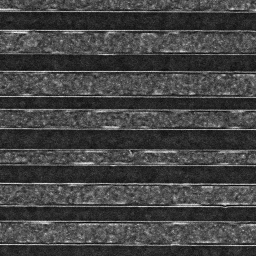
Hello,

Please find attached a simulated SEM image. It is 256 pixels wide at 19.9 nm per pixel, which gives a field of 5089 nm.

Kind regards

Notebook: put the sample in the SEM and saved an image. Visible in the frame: parallel lines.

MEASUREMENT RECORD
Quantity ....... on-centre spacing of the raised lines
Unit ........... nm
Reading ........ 767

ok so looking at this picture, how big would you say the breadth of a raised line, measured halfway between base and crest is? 360 nm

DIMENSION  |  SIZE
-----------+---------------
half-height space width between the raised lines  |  440 nm